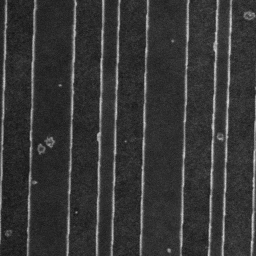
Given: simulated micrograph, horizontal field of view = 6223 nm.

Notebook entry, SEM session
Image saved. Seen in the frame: lines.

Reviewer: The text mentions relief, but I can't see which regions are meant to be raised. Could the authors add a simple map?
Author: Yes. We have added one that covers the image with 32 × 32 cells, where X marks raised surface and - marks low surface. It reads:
X---XXXXX----XX---XXXXXX---XX---
X---XXXXX----XX---XXXXX----XX---
X---XXXXX----XX---XXXXX----XX---
X---XXXXX----XX---XXXXX----XX---
X---XXXXX----XX---XXXXX----XX---
X---XXXXX----XX---XXXXX----XX---
X---XXXXX----XX---XXXXX----XX---
X---XXXXX----XX---XXXXX----XX---
X---XXXXX----XX---XXXXX----XX---
----XXXXX----XX---XXXXX----XX---
----XXXXX----XX---XXXXX----XX---
----XXXXX----XX---XXXXX----XX---
----XXXXX----XX---XXXXX----XX---
----XXXXX----XX---XXXXX----X----
----XXXXX----X----XXXXX----X----
----XXXXX----X----XXXXX----X----
----XXXXX---XX----XXXXX----X----
----XXXXX---XX----XXXXX----X----
----XXXXX---XX----XXXXX----X----
----XXXXX---XX----XXXXX----X----
----XXXXX---XX----XXXXX----X----
----XXXXX---XX----XXXXX----X----
----XXXXX---XX----XXXXX---XX----
----XXXXX---XX----XXXXX---XX----
----XXXXX---XX----XXXXX---XX----
----XXXXX---XX----XXXXX---XX----
----XXXXX---XX----XXXXX---XX----
----XXXXX---XX----XXXXX---XX----
---XXXXXX---XX----XXXXX---XX----
---XXXXX----XX----XXXXX---XX----
---XXXXX----XX----XXXXX---XX---X
---XXXXX----XX----XXXXX---XX---X